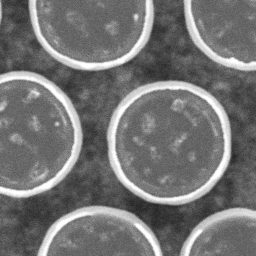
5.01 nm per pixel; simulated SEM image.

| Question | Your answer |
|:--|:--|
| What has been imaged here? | raised bodies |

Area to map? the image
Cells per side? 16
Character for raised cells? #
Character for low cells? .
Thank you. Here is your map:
..#######...####
..#######...####
...######...####
....####.....###
................
###......###....
####....#####...
#####..#######..
#####..#######..
#####..#######..
####...#######..
###.....#####...
..........#.....
.....###......##
...######...####
...#######..####